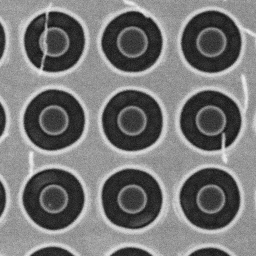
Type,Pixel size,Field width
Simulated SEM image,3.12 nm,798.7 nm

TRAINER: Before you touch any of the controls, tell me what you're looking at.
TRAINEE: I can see an array of small figures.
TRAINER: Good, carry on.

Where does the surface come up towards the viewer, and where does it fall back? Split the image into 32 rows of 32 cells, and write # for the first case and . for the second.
################################
#####...#######...#######...####
####......####.....####......###
.##...#....##...#...###.......##
.##..###...#...###..###..###..##
.##..####..#...###...#...###..##
.##..###...##..###..###..###..##
###.......###.......###.......##
####.....#####.....#####.....###
################################
################################
#####....######...######....####
####......###.......###......###
.##...##...##...#...###..##...##
.##..###...##..###..##...###..##
.##..###...##..###...#...###..##
.##...##...##...##..##...##...##
####......###.......###.......##
#####....#####.....#####....####
################################
################################
####.....#####.....#####.....###
###.......###.......###.......##
.##...##...##...##..##...##...##
.##..###...#...###...#...###..##
.##..###...##..###...#...###..##
.##...#...###...#...###...#...##
####......###.......###......###
#####....######...######....####
################################
################################
####.....#####.....#####.....###